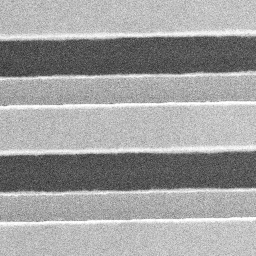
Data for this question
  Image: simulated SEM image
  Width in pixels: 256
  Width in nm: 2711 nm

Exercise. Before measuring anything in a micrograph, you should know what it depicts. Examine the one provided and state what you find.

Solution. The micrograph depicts lines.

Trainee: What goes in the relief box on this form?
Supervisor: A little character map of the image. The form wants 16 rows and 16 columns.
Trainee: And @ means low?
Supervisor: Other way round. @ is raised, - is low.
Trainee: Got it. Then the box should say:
@@@@@@@@@@@@@@@@
@@@@@@@@@@@@@@@@
----------------
----------------
----------------
@@@@@@@@@@@@@@@@
@@@@@@@@@@@@@@@@
@@@@@@@@@@@@@@@@
@@@@@@@@@@@@@@@@
@@@-@-----------
----------------
----------------
@@@@@@@@@@@@@@@@
@@@@@@@@@@@@@@@@
@@@@@@@@@@@@@@@@
@@@@@@@@@@@@@@@@